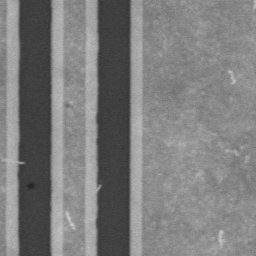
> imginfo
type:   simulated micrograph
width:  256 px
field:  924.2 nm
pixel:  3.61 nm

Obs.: one or a few lines or trenches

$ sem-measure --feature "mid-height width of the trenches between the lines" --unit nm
166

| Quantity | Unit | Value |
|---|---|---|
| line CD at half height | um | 0.118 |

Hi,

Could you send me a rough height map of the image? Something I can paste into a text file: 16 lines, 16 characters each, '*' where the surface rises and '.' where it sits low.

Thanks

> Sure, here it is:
*...**...*******
*...**...*******
*...**...*******
*...**...*******
*...**...*******
*...**...*******
*...**...*******
*...**...*******
*...**...*******
*...**...*******
*...**...*******
*...**...*******
*...**...*******
*...**...*******
*...**...*******
*...**...*******